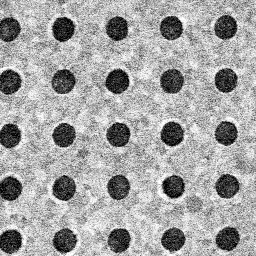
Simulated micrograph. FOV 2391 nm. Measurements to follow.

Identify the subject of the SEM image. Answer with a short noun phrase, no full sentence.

a regular array of holes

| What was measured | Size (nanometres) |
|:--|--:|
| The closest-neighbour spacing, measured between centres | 492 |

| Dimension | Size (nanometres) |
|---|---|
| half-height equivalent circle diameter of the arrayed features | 235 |